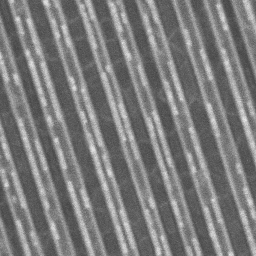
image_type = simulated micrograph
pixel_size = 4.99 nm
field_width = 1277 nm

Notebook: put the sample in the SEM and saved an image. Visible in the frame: parallel lines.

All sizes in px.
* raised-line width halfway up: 14.3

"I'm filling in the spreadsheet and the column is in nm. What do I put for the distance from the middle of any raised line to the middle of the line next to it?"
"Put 153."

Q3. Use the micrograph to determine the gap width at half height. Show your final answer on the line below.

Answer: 16.9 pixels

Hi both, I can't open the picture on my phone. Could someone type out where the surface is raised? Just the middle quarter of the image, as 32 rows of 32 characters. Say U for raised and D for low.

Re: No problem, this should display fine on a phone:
UUUDDDDDDUUUDDDDUUUDDDDDUUUDDDDD
DUUUDDDDDUUUDDDDUUUUDDDDUUUUDDDD
DUUUDDDDDUUUDDDDDUUUDDDDUUUUDDDD
DUUUDDDDDUUUUDDDDUUUDDDDDUUUDDDD
DUUUUDDDDDUUUDDDDUUUUDDDDUUUUDDD
DDUUUDDDDDUUUDDDDDUUUDDDDUUUUDDD
DDUUUDDDDDUUUUDDDDUUUDDDDDUUUDDD
DDUUUUDDDDDUUUDDDDUUUUDDDDUUUUDD
DDDUUUDDDDDUUUDDDDDUUUDDDDUUUUDD
DDDUUUUDDDDUUUUDDDDUUUDDDDUUUUDD
DDDUUUUDDDDDUUUDDDDUUUUDDDDUUUDD
DDDDUUUDDDDDUUUDDDDDUUUDDDDUUUUD
DDDDUUUUDDDDUUUDDDDDUUUDDDDUUUUD
DDDDUUUUDDDDDUUUDDDDUUUUDDDDUUUD
DDDDDUUUDDDDDUUUDDDDDUUUDDDDUUUU
DDDDDUUUDDDDDUUUDDDDDUUUDDDDUUUU
UDDDDUUUUDDDDUUUUDDDDUUUDDDDDUUU
UDDDDDUUUDDDDDUUUDDDDUUUUDDDDUUU
UDDDDDUUUDDDDDUUUDDDDDUUUDDDDUUU
UUDDDDUUUUDDDDUUUUDDDDUUUDDDDDUU
UUDDDDDUUUDDDDDUUUDDDDUUUUDDDDUU
UUDDDDDUUUDDDDDUUUDDDDDUUUDDDDUU
UUDDDDDUUUUDDDDUUUUDDDDUUUDDDDUU
UUUDDDDUUUUDDDDDUUUDDDDUUUUDDDDU
UUUDDDDDUUUDDDDDUUUDDDDDUUUDDDDU
UUUDDDDDUUUDDDDDUUUUDDDDUUUDDDDU
UUUUDDDDUUUUDDDDDUUUDDDDUUUUDDDD
UUUUDDDDDUUUDDDDDUUUDDDDDUUUDDDD
UUUUDDDDDUUUDDDDDUUUUDDDDUUUDDDD
UUUUUDDDDUUUUDDDDDUUUDDDDUUUUDDD
DUUUUDDDDDUUUDDDDDUUUDDDDDUUUDDD
DUUUUDDDDDUUUDDDDDUUUDDDDDUUUDDD